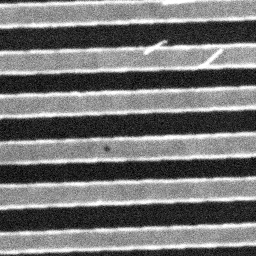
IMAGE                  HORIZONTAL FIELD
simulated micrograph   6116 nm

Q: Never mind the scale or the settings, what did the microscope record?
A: lines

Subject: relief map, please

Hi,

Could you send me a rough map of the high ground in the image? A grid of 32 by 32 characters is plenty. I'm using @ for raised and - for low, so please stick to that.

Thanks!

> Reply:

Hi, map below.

--@@@@@@@@@@@@@@@@@@@@@@@@@@@@@@
@@@@@@@@@@@@@@@@@@@@@@@@@@@@@@@@
@@@@@@@@@@@@@@@@@@@@@@@@@@------
--------------------------------
--------------------------------
--------------------------------
@@@@@@@@@@@@@@@@@@@@@@@@@@@@@@@@
@@@@@@@@@@@@@@@@@@@@@@@@@@@@@@@@
@@@@@@@@@@@@@@@@@@@@@@@@@-------
--------------------------------
--------------------------------
-------------@@@@@@@@@@@@@@@@@@@
@@@@@@@@@@@@@@@@@@@@@@@@@@@@@@@@
@@@@@@@@@@@@@@@@@@@@@@@@@@@@@@@@
@@@@@@--------------------------
--------------------------------
--------------------------------
--------@@@@@@@@@@@@@@@@@@@@@@@@
@@@@@@@@@@@@@@@@@@@@@@@@@@@@@@@@
@@@@@@@@@@@@@@@@@@@@@@@@@@@@@@@-
--------------------------------
--------------------------------
----------------------@@@@@@@@@@
@@@@@@@@@@@@@@@@@@@@@@@@@@@@@@@@
@@@@@@@@@@@@@@@@@@@@@@@@@@@@@@@@
@@@@@@@@@@@@@@@@@---------------
--------------------------------
--------------------------------
------------------@@@@@@@@@@@@@@
@@@@@@@@@@@@@@@@@@@@@@@@@@@@@@@@
@@@@@@@@@@@@@@@@@@@@@@@@@@@@@@@@
@@@@@---------------------------